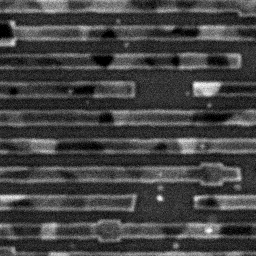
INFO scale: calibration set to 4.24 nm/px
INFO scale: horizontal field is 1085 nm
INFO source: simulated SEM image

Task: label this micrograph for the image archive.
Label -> wiring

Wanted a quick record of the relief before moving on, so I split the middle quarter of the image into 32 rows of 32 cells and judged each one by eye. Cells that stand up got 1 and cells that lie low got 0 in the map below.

11111111111111111111111111111111
00000000000000000000000000000000
00000000000000000000000000000000
00000000000000000000000000000000
00000000000000000000000000000000
11111111111111111000000000000000
11111111111111111000000000000000
11111111111111111000000000000000
00000000000000000000000000000000
00000000000000000000000000000000
00000000000000000000000000000000
00000000000000000000000000000000
11111111111111111111111111111111
11111111111111111111111111111111
11111111111111111111111111111111
00000000000000000000000000000000
00000000000000000000000000000000
00000000000000000000000000000000
00000000000000000000000000000000
11111111111111111111111111111111
11111111111111111111111111111111
11111111111111111111111111111111
00000000000000000000000000000000
00000000000000000000000000000000
00000000000000000000000000000000
00000000000000000000000000000000
11111111111111111111111111111111
11111111111111111111111111111111
11111111111111111111111111111111
00000000000000000000000000000000
00000000000000000000000000000000
00000000000000000000000000000000